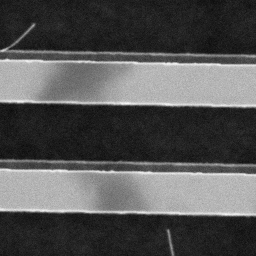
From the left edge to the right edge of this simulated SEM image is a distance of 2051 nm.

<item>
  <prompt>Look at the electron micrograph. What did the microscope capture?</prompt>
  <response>lines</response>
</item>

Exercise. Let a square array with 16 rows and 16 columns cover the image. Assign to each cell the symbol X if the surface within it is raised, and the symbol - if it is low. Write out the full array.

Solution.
----------------
----------------
----------------
XXXXXXXXXXXXXXXX
XXXXXXXXXXXXXXXX
XXXXXXXXXXXXXXXX
----------XXXXXX
----------------
----------------
----------------
XXXXXXXXXXXXXXXX
XXXXXXXXXXXXXXXX
XXXXXXXXXXXXXXXX
----------------
----------------
----------------